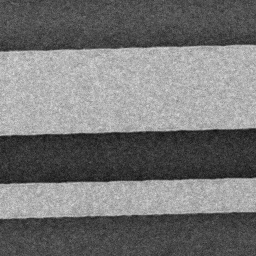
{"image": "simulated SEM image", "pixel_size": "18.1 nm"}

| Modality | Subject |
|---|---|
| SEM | lines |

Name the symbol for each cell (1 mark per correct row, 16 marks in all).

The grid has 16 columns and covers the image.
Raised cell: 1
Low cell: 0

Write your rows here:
0000000000000000
0000000000000000
0000000000000000
1111111111111111
1111111111111111
1111111111111111
1111111111111111
1111111111111111
0000000000000000
0000000000000000
0000000000000000
0111111111111111
1111111111111111
1111110000000000
0000000000000000
0000000000000000